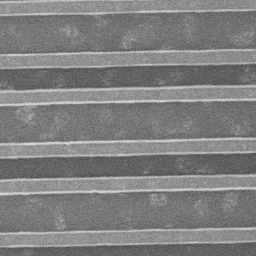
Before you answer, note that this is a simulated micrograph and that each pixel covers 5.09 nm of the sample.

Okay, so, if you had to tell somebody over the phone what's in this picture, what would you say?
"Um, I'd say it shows parallel lines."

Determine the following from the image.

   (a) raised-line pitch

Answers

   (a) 228 nm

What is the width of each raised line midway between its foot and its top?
0.0712 µm